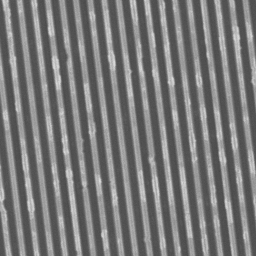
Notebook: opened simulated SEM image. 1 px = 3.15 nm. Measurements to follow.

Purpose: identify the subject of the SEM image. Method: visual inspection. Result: parallel lines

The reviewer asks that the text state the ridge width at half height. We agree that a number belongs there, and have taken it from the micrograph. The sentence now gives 0.0211 µm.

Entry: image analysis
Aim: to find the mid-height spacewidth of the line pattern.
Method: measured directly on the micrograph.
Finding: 23.8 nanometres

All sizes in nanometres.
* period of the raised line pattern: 44.1